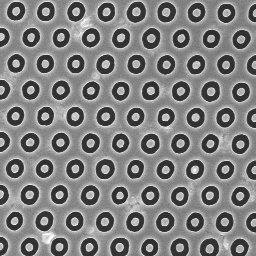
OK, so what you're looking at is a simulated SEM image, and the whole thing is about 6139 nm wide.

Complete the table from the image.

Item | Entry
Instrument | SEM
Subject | a regular array of ring-shaped grooves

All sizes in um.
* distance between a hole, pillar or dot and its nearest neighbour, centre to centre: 0.71